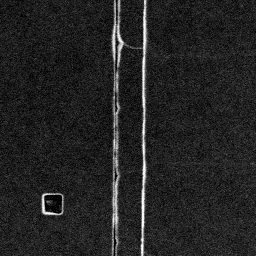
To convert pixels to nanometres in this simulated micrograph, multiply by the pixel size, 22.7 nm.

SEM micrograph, wiring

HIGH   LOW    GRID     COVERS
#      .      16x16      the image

.........#######
.........#######
.........#######
.........#######
.........#######
.........#######
.........#######
.........#######
.........#######
.........#######
.........#######
.........#######
.........#######
.........#######
.........#######
.........#######